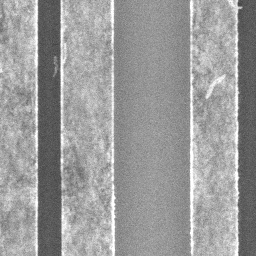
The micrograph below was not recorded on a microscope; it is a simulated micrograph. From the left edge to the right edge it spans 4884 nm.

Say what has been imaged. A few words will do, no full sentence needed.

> lines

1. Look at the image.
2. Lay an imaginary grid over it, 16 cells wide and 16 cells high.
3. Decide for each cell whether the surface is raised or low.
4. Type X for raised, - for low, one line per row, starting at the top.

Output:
XX--XXX-----XXX-
XX--XXX-----XXX-
XX--XXX-----XXX-
XX--XXX-----XXX-
XX--XXX-----XXX-
XX--XXX-----XXX-
XX--XXX-----XXX-
XX--XXX-----XXX-
XX--XXX-----XXX-
XX--XXX-----XXX-
XX--XXX-----XXX-
XX--XXX-----XXX-
XX--XXX-----XXX-
XX--XXX-----XXX-
XX--XXX-----XXX-
XX--XXX-----XXX-